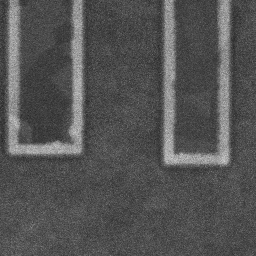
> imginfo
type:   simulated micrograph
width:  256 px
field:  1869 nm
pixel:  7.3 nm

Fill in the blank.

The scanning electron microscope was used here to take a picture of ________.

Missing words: one or a few lines or trenches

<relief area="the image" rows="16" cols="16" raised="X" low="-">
-XXXX------XXX--
-XXXX------XXX--
-XXXX------XXX--
-XXXX------XXX--
-XXXX------XXX--
-XXXX------XXX--
-XXXX------XXX--
-XXXX------XXX--
-XXXX------XXX--
-----------XXX--
----------------
----------------
----------------
----------------
----------------
----------------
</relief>